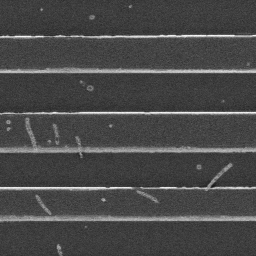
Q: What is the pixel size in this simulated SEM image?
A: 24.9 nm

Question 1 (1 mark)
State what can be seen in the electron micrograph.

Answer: lines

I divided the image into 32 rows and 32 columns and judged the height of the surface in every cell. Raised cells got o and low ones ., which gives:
................................
................................
................................
................................
................................
oooooooooooooooooooooooooooooooo
oooooooooooooooooooooooooooooooo
oooooooooooooooooooooooooooooooo
oooooooooooooooooooooooooooooooo
................................
................................
................................
................................
................................
oooooooooooooooooooooooooooooooo
oooooooooooooooooooooooooooooooo
oooooooooooooooooooooooooooooooo
oooooooooooooooooooooooooooooooo
oooooooooooooooooooooooooooooooo
................................
................................
................................
................................
.........................oo.....
oooooooooooooooooooooooooooooooo
oooooooooooooooooooooooooooooooo
oooooooooooooooooooooooooooooooo
................................
................................
................................
................................
................................